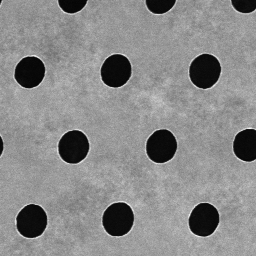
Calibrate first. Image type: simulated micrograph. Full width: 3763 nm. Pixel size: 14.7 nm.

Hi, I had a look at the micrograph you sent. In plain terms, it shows a regular array of holes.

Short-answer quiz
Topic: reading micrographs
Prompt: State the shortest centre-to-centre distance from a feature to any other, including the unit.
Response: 1250 nm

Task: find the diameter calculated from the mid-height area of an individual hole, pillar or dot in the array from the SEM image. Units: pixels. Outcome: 32.4